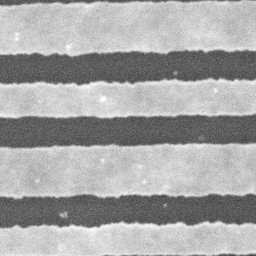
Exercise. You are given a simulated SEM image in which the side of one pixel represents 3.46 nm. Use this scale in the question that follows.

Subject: lines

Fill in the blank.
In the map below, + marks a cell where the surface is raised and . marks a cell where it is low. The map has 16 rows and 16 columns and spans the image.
++++++++++++++++
++++++++++++++++
++++++++++++++++
................
................
++++++++++++++++
++++++++++++++++
................
................
++++++++++++++++
++++++++++++++++
++++++++++++++++
................
................
++++++++++++++++
++++++++++++++++